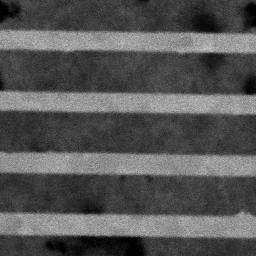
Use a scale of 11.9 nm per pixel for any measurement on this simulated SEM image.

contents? one or a few lines or trenches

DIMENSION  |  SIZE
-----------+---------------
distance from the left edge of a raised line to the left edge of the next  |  730 nanometers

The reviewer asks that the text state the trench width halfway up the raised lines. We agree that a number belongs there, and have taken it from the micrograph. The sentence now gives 502 nm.